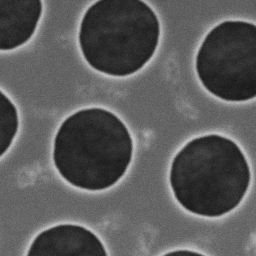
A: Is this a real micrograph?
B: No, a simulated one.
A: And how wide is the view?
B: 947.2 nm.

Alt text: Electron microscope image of holes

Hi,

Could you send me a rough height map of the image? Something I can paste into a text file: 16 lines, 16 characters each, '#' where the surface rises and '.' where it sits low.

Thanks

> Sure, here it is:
...###...#######
..###.....####..
..###.....###...
#####....###....
######..####....
#############...
.###############
.###...#########
.###....#####.##
###.....###....#
####....###.....
####...####.....
###########....#
#############.##
###...##########
##.....#########